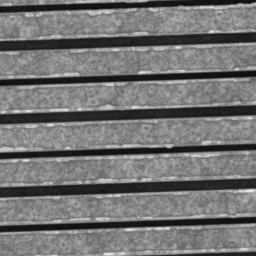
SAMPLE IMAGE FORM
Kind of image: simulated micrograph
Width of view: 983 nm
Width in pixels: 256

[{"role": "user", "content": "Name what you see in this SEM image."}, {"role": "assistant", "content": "parallel lines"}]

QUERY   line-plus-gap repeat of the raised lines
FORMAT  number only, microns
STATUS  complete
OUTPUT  0.141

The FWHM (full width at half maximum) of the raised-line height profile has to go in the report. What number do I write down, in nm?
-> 108